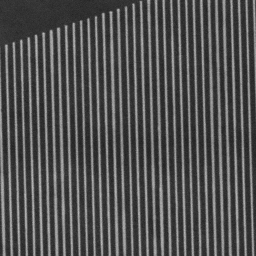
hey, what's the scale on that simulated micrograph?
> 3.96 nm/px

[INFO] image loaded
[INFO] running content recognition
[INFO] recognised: parallel lines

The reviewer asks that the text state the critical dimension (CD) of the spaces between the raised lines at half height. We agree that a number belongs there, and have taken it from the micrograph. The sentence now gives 23.3 nanometres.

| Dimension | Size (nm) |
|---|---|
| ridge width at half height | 5.9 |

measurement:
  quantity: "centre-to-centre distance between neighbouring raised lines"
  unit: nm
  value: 29.9